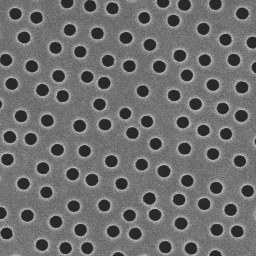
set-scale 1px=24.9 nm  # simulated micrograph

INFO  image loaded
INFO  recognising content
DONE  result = a regular array of holes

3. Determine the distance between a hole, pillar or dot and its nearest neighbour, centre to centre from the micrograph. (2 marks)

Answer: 572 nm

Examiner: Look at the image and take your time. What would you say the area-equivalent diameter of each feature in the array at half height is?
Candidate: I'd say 313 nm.